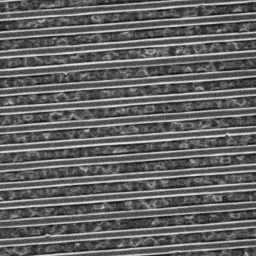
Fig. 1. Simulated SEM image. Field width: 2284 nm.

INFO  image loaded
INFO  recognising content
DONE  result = parallel lines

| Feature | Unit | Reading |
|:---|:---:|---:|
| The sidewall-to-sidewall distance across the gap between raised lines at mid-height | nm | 104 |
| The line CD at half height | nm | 66.7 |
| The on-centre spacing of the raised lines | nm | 168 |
